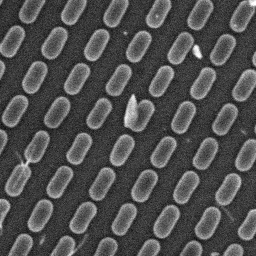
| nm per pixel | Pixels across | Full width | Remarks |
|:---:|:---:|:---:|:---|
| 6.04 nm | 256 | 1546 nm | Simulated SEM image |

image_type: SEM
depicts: groups of lines, slits or small figures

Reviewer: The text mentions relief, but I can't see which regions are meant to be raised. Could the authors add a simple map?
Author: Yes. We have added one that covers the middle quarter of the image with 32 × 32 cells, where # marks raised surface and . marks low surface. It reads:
...###........##................
..####.......####.......###.....
..####.......####......####.....
.#####......####.......####.....
.####......#####......####......
#####......####.......####......
####.......####......####.......
.#.........###........##........
.................#..............
#.......###.....##.##...........
#.......####....######.......###
#......#####....######......####
#......####....#######......####
......####.....######.......####
......####.....######......####.
......###......#####.......####.
.................###.......####.
....##..........................
...####.......###........##.....
...####......####.......####....
..####.......####......#####....
.#####......#####......####.....
.####.......####......#####.....
.####.......####......####......
..##........###.......####......
.......................##.......
##.......###....................
##.......####......####.......##
##......#####......####......###
#.......####......#####......###
.......####.......####......####
.......####......#####......####